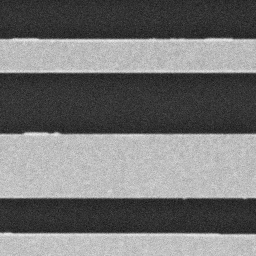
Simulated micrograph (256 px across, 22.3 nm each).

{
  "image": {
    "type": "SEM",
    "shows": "lines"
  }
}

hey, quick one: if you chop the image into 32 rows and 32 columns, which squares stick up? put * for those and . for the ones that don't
................................
................................
................................
................................
................................
********************************
********************************
********************************
********************************
................................
................................
................................
................................
................................
................................
................................
................................
********************************
********************************
********************************
********************************
********************************
********************************
********************************
********************************
................................
................................
................................
................................
********************************
********************************
********************************